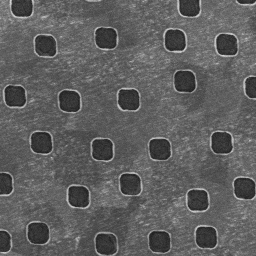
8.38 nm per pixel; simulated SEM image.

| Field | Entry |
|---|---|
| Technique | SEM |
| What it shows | a regular array of holes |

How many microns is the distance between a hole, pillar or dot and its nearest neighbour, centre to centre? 0.421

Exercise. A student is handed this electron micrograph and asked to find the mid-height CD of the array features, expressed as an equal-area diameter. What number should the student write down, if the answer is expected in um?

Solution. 0.198